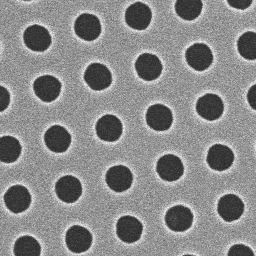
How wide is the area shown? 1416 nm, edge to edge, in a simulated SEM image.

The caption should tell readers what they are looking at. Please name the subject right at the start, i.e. a regular array of holes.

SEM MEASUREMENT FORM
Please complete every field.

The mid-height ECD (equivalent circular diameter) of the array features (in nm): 155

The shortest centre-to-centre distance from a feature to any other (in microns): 0.283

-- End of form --